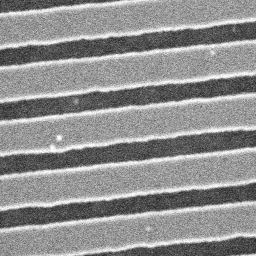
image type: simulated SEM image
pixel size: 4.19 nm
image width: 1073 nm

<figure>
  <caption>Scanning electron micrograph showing lines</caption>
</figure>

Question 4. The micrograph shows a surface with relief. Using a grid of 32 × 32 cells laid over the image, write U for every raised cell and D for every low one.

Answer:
DDDDDDDDDDDDDUUUUUUUUUUUUUUUUUUU
DDUUUUUUUUUUUUUUUUUUUUUUUUUUUUUU
UUUUUUUUUUUUUUUUUUUUUUUUUUUUUUUU
UUUUUUUUUUUUUUUUUUUUUUUDUDDDDDDD
UUUUUUUUUUUUUUDDDDDDDDDDDDDDDDDD
UUUUDDDDDDDDDDDDDDDDDDDDDDDDUUUU
DDDDDDDDDDDDDDDDDDUUUUUUUUUUUUUU
DDDDDDDDUUUUUUUUUUUUUUUUUUUUUUUU
UUUUUUUUUUUUUUUUUUUUUUUUUUUUUUUU
UUUUUUUUUUUUUUUUUUUUUUUUUUUUUUDD
UUUUUUUUUUUUUUUUUUUUDDDDDDDDDDDD
UUUUUUUUUUUDDDDDDDDDDDDDDDDDDDDD
UUDDDDDDDDDDDDDDDDDDDDDDUUUUUUUU
DDDDDDDDDDDDDDDUUUUUUUUUUUUUUUUU
DDDDDDUUUUUUUUUUUUUUUUUUUUUUUUUU
UUUUUUUUUUUUUUUUUUUUUUUUUUUUUUUU
UUUUUUUUUUUUUUUUUUUUUUUUUUDDDDDD
UUUUUUUUUUUUUUUUUUDDDDDDDDDDDDDD
UUUUUUUUUDDDDDDDDDDDDDDDDDDDDDDD
DDDDDDDDDDDDDDDDDDDDDDDUUUUUUUUU
DDDDDDDDDDDDDUUUUUUUUUUUUUUUUUUU
DDDDDUUUUUUUUUUUUUUUUUUUUUUUUUUU
UUUUUUUUUUUUUUUUUUUUUUUUUUUUUUUU
UUUUUUUUUUUUUUUUUUUUUUUUUUDDDDDD
UUUUUUUUUUUUUUUUDDDDDDDDDDDDDDDD
UUUUUUUUDDDDDDDDDDDDDDDDDDDDDUUU
DDDDDDDDDDDDDDDDDDDDUUUUUUUUUUUU
DDDDDDDDDDDUUUUUUUUUUUUUUUUUUUUU
DDUUUUUUUUUUUUUUUUUUUUUUUUUUUUUU
UUUUUUUUUUUUUUUUUUUUUUUUUUUUUUUU
UUUUUUUUUUUUUUUUUUUUUDDDDDDDDDDD
UUUUUUUUUUUUUDDDDDDDDDDDDDDDDDDD